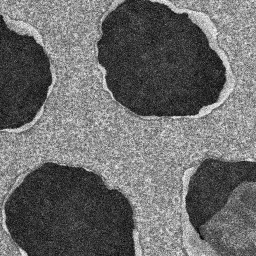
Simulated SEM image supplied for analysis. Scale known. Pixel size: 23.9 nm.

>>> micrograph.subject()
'holes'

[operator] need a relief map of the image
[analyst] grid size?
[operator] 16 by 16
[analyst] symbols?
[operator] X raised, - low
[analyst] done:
XXXXXXX----XXXXX
-XXXXX------XXXX
--XXXX-------XXX
---XXX--------XX
---XXXX-------XX
---XXXX-------XX
---XXXXX-----XXX
--XXXXXXXXXXXXXX
XXXXXXXXXXXXXXXX
XXXXXXXXXXXXXXXX
XX---XXXXXXX----
X------XXXXX----
--------XXXX----
--------XXXX----
X-------XXXX----
X-------XXXX----